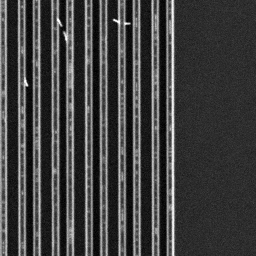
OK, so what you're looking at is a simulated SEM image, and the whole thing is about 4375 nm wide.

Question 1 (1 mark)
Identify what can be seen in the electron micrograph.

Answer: parallel lines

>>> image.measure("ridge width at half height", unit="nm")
94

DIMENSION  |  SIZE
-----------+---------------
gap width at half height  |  164 nm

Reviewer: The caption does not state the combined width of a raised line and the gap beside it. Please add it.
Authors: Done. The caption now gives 0.281 um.